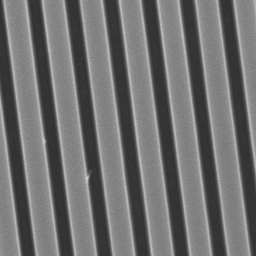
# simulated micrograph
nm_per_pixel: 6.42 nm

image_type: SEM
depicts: parallel lines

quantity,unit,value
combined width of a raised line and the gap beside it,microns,0.244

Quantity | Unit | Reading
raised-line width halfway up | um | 0.153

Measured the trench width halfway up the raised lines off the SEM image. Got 91.5 nm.